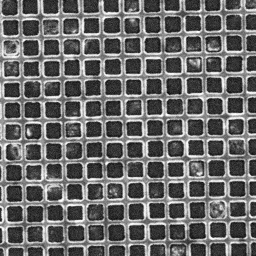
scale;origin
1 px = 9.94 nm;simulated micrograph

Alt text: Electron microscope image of a regular array of holes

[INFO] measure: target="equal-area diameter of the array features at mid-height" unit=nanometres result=186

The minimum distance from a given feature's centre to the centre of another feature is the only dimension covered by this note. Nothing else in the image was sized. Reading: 199 nm